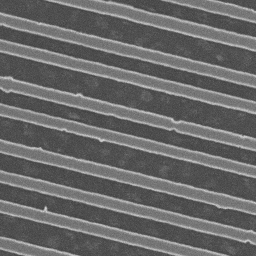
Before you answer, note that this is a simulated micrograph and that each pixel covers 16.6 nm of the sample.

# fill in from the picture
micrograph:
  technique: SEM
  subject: parallel lines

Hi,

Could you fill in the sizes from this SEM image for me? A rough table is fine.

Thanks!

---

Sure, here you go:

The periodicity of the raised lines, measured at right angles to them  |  0.511 micrometres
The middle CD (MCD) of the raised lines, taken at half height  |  193 nanometers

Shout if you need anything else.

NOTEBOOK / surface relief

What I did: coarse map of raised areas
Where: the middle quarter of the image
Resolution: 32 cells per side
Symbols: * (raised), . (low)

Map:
***********...............******
...************...............**
.......************.............
...........************.........
...............************.....
...................************.
........................********
**..........................****
******..........................
**********......................
..************..................
......************..............
..........************..........
..............************......
***...............************..
*******................*********
***********.................****
...************................*
........***********.............
...........************.........
................***********.....
....................***********.
........................********
***.........................****
*******.........................
***********.....................
..*************.................
......*************.............
..........*************.........
..............*************.....
...................************.
****..................**********